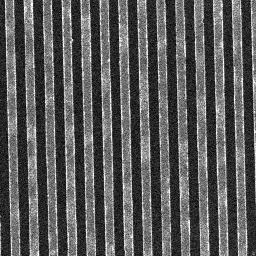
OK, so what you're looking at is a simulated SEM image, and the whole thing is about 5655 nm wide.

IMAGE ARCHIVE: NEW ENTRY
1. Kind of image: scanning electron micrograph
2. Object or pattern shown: parallel lines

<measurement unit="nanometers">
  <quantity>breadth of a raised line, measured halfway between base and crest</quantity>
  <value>188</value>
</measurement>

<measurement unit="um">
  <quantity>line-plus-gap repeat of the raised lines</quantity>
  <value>0.418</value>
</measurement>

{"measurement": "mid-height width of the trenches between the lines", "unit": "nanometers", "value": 229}